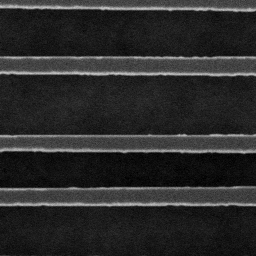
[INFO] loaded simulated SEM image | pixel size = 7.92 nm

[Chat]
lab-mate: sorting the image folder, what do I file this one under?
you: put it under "lines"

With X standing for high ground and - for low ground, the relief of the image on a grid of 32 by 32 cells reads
XXXXXXXXXXXXXXXXXXXXXXXXXXXXXXXX
--------------------------------
--------------------------------
--------------------------------
--------------------------------
--------------------------------
--------------------------------
XXXXXXXXXXXXXXXXXXXXXXXXXXXXXXXX
XXXXXXXXXXXXXXXXXXXXXXXXXXXXXXXX
--------------------------------
--------------------------------
--------------------------------
--------------------------------
--------------------------------
--------------------------------
--------------------------------
--------------------------------
XXXXXXXXXXXXXXXXXXXXXXXXXXXXXXXX
XXXXXXXXXXXXXXXXXXXXXXXXXXXXXXXX
--------------------------------
--------------------------------
--------------------------------
--------------------------------
--------XX--XXXXXXXXXXXXXXXXXXXX
XXXXXXXXXXXXXXXXXXXXXXXXXXXXXXXX
XXXXXXXXXXXXXXXXXXXXXXXXXXXXXXXX
--------------------------------
--------------------------------
--------------------------------
--------------------------------
--------------------------------
--------------------------------